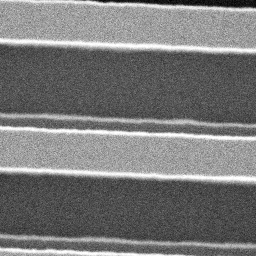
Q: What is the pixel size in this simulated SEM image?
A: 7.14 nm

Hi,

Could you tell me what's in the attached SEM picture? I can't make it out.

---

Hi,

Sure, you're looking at lines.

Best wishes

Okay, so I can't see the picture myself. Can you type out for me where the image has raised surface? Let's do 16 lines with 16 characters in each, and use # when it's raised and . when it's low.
##############..
################
################
................
................
................
................
................
##############..
################
################
................
................
................
................
................